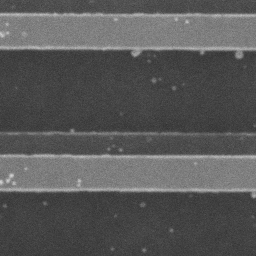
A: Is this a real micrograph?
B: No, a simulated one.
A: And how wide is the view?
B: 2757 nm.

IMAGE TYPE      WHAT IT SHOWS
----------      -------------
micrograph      lines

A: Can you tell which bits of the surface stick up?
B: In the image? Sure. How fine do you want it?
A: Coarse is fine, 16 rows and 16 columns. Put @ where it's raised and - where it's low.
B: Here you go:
@@@@@@@@@@@@@@@@
@@@@@@@@@@@@@@@@
@@@@@@@@@@@@@@@@
----------------
----------------
----------------
----------------
----------------
@@@@@@@@@@@@@@@@
@@@@@@@@@@@@@@@@
@@@@@@@@@@@@@@@@
@@@@@@@@@@@@@@@@
----------------
----------------
----------------
----------------